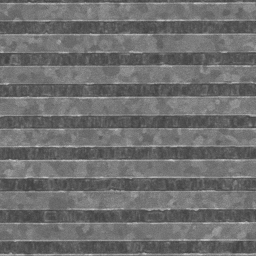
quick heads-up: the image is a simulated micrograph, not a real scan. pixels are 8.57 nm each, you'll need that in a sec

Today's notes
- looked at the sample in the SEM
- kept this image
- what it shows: parallel lines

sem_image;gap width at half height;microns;0.118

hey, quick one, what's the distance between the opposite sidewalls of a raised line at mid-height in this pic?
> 154 nanometers